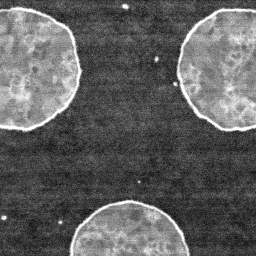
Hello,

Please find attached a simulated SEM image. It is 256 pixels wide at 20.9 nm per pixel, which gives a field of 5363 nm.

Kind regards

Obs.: raised bodies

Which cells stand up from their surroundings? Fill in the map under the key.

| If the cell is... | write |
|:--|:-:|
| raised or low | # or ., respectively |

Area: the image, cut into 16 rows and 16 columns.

................
####........####
#####.......####
#####......#####
#####......#####
#####......#####
####........####
###..........###
................
................
................
................
................
......####......
.....######.....
....########....